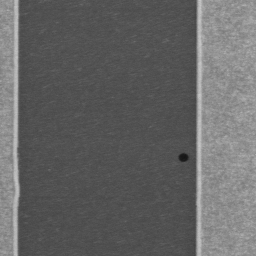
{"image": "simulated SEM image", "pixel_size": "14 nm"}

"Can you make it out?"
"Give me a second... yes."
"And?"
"one or a few lines or trenches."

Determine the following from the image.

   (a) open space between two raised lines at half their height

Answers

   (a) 2570 nm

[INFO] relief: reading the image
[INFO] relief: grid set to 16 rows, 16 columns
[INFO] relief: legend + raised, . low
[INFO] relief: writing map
+...........++++
+...........++++
+...........++++
+............+++
+............+++
+............+++
+............+++
+............+++
+............+++
+............+++
+...........++++
+...........++++
+...........++++
+...........++++
+...........++++
+...........++++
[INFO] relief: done